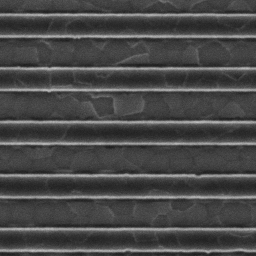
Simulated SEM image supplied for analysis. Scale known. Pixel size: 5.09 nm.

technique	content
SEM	parallel lines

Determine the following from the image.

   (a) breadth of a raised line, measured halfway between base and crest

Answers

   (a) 0.116 um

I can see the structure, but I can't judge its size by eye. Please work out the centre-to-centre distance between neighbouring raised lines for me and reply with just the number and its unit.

273 nm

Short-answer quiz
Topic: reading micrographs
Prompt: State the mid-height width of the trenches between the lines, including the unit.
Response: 0.158 microns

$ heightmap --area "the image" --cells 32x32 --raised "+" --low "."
................................
................................
++++++++++++++++++++++++++++++++
++++++++++++++++++++++++++++++++
++++++++++++++++++++++++++++++++
................................
................................
................................
..+.............................
++++++++++++++++++++++++++++++++
++++++++++++++++++++++++++++++++
................................
................................
................................
................................
++++++++++++++++++++++++++++++++
++++++++++++++++++++++++++++++++
++++++++++++++++++++++++++++++++
................................
................................
................................
................................
++++++++++++++++++++++++++++++++
++++++++++++++++++++++++++++++++
++++++++++++++++++++++++++++++++
................................
................................
................................
................................
++++++++++++++++++++++++++++++++
++++++++++++++++++++++++++++++++
................................